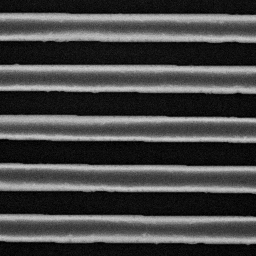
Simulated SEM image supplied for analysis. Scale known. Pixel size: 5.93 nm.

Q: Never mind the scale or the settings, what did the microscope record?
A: lines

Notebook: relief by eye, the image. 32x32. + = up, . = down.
................................
................................
++++++++++++++++++++++++++++++++
++++++++++++++++++++++++++++++++
++++++++++++++++++++++++++++++++
................................
................................
................................
++++++++++++++++++++++++++++++++
++++++++++++++++++++++++++++++++
++++++++++++++++++++++++++++++++
...........................+++++
................................
................................
................................
++++++++++++++++++++++++++++++++
++++++++++++++++++++++++++++++++
..............++++++++++++++++++
................................
................................
................................
++++++++++++++++++++++++++++++++
++++++++++++++++++++++++++++++++
++++++++++++++++++++++++++++++++
................................
................................
................................
++++++++++++++++++++++++++++++++
++++++++++++++++++++++++++++++++
++++++++++++++++++++++++++++++++
................................
................................